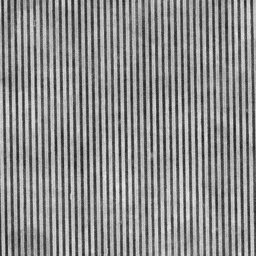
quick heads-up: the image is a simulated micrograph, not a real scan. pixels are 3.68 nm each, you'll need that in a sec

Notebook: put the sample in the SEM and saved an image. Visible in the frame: parallel lines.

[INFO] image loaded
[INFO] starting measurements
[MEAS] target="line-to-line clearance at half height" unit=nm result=12.4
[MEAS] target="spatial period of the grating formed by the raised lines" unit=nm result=23.5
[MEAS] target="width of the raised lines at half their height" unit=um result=0.0092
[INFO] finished